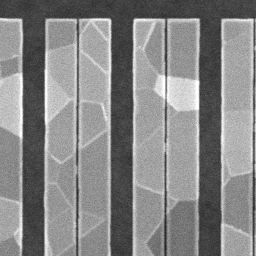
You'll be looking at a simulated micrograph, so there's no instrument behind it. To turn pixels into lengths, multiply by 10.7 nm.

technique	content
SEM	wiring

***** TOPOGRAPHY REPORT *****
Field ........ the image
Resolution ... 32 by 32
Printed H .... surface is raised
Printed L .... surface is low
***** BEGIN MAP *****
LLLLLLLLLLLLLLLLLLLLLLLLLLLLLLLL
LLLLLLLLLLLLLLLLLLLLLLLLLLLLLLLL
HHLLLLHHHLHHHLLLLLHHLHHHHLLLHHLL
HHHLLLHHHHHHHHLLLHHHHHHHHLLLHHHH
HHHLLLHHHHHHHHLLLHHHHHHHHLLLHHHH
HHHLLLHHHHHHHHLLLHHHHHHHHLLLHHHH
HHHLLLHHHHHHHHLLLHHHHHHHHLLLHHHH
HHHLLLHHHHHHHHLLLHHHHHHHHLLLHHHH
HHHLLLHHHHHHHHLLLHHHHHHHHLLLHHHH
HHHLLLHHHHHHHHLLLHHHHHHHHLLLHHHH
HHHLLLHHHHHHHHLLLHHHHHHHHLLLHHHH
HHHLLLHHHHHHHHLLLHHHHHHHHLLLHHHH
HHHLLLHHHHHHHHLLLHHHHHHHHLLLHHHH
HHHLLLHHHHHHHHLLLHHHHHHHHLLLHHHH
HHHLLLHHHHHHHHLLLHHHHHHHHLLLHHHH
HHHLLLHHHHHHHHLLLHHHHHHHHLLLHHHH
HHHLLLHHHHHHHHLLLHHHHHHHHLLLHHHH
HHHLLLHHHHHHHHLLLHHHHHHHHLLLHHHH
HHHLLLHHHHHHHHLLLHHHHHHHHLLLHHHH
HHHLLLHHHHHHHHLLLHHHHHHHHLLLHHHH
HHHLLLHHHHHHHHLLLHHHHHHHHLLLHHHH
HHHLLLHHHHHHHHLLLHHHHHHHHLLLHHHH
HHHLLLHHHHHHHHLLLHHHHHHHHLLLHHHH
HHHLLLHHHHHHHHLLLHHHHHHHHLLLHHHH
HHHLLLHHHHHHHHLLLHHHHHHHHLLLHHHH
HHHLLLHHHHHHHHLLLHHHHHHHHLLLHHHH
HHHLLLHHHHHHHHLLLHHHHHHHHLLLHHHH
HHHLLLHHHHHHHHLLLHHHHHHHHLLLHHHH
HHHLLLHHHHHHHHLLLHHHHHHHHLLLHHHH
HHHLLLHHHHHHHHLLLHHHHHHHHLLLHHHH
HHHLLLHHHHHHHHLLLHHHHHHHHLLLHHHH
HHHLLLHHHHHHHHLLLHHHHHHHHLLLHHHH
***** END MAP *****